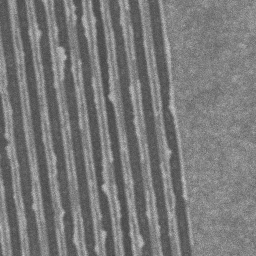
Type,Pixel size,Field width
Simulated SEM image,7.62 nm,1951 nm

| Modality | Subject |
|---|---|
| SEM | parallel lines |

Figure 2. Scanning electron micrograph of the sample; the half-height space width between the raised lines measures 0.0727 microns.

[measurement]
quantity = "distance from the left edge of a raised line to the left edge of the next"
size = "18.7 pixels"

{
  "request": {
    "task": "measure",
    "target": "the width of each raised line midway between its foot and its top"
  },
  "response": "0.0722 um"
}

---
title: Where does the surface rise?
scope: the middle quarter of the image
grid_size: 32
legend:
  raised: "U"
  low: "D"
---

DDUUDDDUUDDUUDDDUUDDDUUDDDUUUUUU
DDUUDDDUUDDUUDDDUUDDDUUDDDUUUUUU
DDUUDDDUUDDUUUDDUUDDDUUDDDUUUUUU
DDUUUDDUUDDUUUDDUUDDDUUDDDUUUUUU
DDDUUDDUUDDUUUDDDUUDDUUUDDUUUUUU
DDDUUDDUUUDUUUDDUUUDDDUUDDDUUUUU
DDDUUDDUUUDUUUDDUUUDDDUUDDUUUUUU
DDDUUDDDUUDUUUDDDUUDDDUUDDUUUUUU
DDDUUDDDUUDUUUDDDUUDDDUUDDUUUUUU
UDDUUDDDUUDDUUDDDUUDDDUUDDUUUUUU
UDDUUDDDUUDDUUUDDUUDDDUUUDUUUUUU
UDDDUUDDUUDDDUUDDUUUDDDUUDUUUUUU
UDDDUUDDUUDDDUUDDUUUDDUUUDDUUUUU
UDDDUUDDDUUDDUUDDDUUDDDUUDDUUUUU
UDDDUUDDDUUDDUUDDUUUDDDUUDDUUUUU
UDDDUUDDDUUDDUUDDDUUDDDUUDDDUUUU
UUDDUUDDDUUDDUUDDDUUDDDUUDDDUUUU
UUDDUUDDDUUDDUUDDDUUDDDUUDDDUUUU
UUDDUUDDDUUDDDUDDDUUDDDUUDDDUUUU
UUDDDUUDDUUUDDUUDDDUUDDDUUDDUUUU
UUDDDUUDDDUUDDUUDDDUUDDDUUDDUUUU
UUDDDUUDDUUUDDUUDDDUUDDDUUDDDUUU
UUDDDUUDDDUUDDUUDDDUUDDDUUUDDUUU
UUDDDUUDDDUUDDUUDDDUUDDDUUDDDUUU
UUDDDUUDDUUUDDUUDDDUUDDDUUDDDUUU
DUUDDUUDDDUUDDDUDDDUUDDDUUDDDUUU
DUUDDDUUDDUUDDDUUDDUUDDDUUUDDUUU
DUUDDDUUDUUUDDDUUDDDUUDDDUUDDUUU
DUUDDDUUDDUUUDDUUDDDUUDDDUUDDUUU
DUUDDDUUDDUUUDDUUDDDUUDDDUUDDUUU
DUUDDDUUDDUUUDDUUDDDUUDDDUUDDDUU
DUUDDDUUDDUUUDDUUDDDUUDDDUUDDDUU